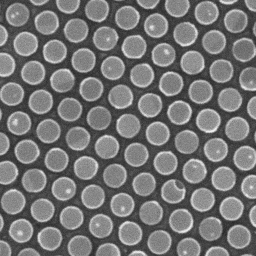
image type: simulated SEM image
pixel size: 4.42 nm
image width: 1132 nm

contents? a regular array of raised bodies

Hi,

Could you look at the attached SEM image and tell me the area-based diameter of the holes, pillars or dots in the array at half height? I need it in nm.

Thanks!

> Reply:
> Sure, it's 104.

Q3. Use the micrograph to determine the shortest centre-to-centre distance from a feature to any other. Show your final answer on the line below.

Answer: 131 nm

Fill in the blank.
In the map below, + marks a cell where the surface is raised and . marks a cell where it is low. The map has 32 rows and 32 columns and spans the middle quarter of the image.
..+++++..++++++...+++...++...+++
+..++++..++++++..+++++........++
++........+++++..+++++...+++....
++....++...+++...+++++..++++++..
++...++++........+++++..++++++..
++..++++++...++....++...++++++..
+...++++++..++++........+++++..+
....+++++..++++++....+...+++...+
.....++++..++++++..+++++........
++++.......++++++..+++++....++..
++++........++++...+++++..+++++.
++++...++++........+++++..++++++
++++..+++++.........+++...++++++
+++...++++++..++++........+++++.
......+++++..++++++........+++..
.......++++..++++++..++++.......
..+++........++++++..+++++......
.+++++........++++...+++++...+++
.+++++...+++.........+++++..++++
.+++++..+++++.........+++...++++
.+++++..++++++..++++........++++
...+....+++++..++++++.......++++
+.......+++++..++++++...+++.....
+...+++...++...++++++..+++++....
+..+++++........++++...+++++...+
+..+++++...+++....+....+++++..++
...+++++..+++++........+++++..++
...+++++..++++++...++...++....++
+...+++...+++++...+++++.......++
++........+++++..++++++...++....
+++...++....++...++++++..+++....
+++..+++++........++++..++++++..